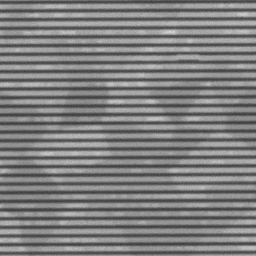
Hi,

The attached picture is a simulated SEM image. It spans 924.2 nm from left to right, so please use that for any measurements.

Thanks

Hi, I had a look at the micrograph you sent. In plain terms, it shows parallel lines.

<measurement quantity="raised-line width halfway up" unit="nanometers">16.7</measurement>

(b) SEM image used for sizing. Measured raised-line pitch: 31.2 nm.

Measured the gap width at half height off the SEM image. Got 3.63 px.